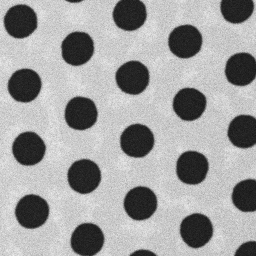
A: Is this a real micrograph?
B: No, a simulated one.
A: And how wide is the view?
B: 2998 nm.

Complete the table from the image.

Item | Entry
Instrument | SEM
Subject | a regular array of holes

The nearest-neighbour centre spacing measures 731 nanometers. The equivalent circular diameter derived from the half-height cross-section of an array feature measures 0.397 microns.